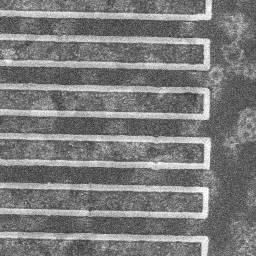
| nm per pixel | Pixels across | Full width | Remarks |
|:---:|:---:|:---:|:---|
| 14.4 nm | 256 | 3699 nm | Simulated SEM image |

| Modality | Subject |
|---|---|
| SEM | parallel lines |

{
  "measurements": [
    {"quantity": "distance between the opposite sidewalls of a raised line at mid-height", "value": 374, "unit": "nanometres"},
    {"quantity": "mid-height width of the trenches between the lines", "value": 347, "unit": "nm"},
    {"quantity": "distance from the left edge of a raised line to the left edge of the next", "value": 714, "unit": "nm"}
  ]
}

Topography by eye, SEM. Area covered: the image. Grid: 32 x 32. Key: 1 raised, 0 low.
11111111111111111111111111000000
11111111111111111111111111000000
00000000000000000000000000000000
00000000000000000000000000000000
00000000000000000000000000000000
11111111111111111111111111000000
11111111111111111111111111000000
11111111111111111111111111000000
00000000000000000000000000000000
00000000000000000000000000000000
00000000000000000000000000000000
11111111111111111111111110000000
11111111111111111111111111000000
11111111111111111111111111000000
00000000000000000000000011000000
00000000000000000000000000000000
00000000000000000000000000000000
11111111111111111110000000000000
11111111111111111111111111000000
11111111111111111111111111000000
00000000000000111001111111000000
00000000000000000000000000000000
00000000000000000000000000000000
11111111111110000000000000000000
11111111111111111111111111000000
11111111111111111111111111000000
00000010111111111111111111000000
00000000000000000000000000000000
00000000000000000000000000000000
11100000000000000000000000000000
11111111111111111111111111000000
11111111111111111111111111000000